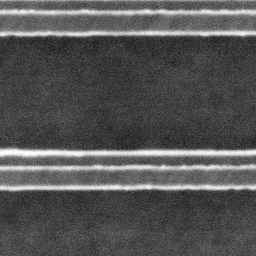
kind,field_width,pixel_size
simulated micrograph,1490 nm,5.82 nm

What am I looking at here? lines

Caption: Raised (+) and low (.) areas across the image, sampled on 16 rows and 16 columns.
++++++++++++++++
++++++++++++++++
................
................
................
................
................
................
................
................
++++++++++++++++
++++++++++++++++
................
................
................
................